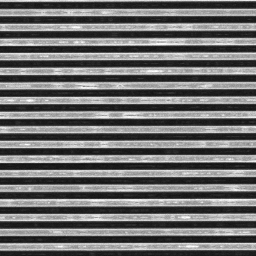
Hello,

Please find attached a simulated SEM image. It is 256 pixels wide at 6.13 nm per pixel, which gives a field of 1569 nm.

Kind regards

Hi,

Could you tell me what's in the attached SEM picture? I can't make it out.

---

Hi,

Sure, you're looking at parallel lines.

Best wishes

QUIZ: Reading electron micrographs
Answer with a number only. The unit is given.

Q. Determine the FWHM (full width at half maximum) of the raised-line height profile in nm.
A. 46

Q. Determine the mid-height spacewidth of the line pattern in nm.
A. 40.6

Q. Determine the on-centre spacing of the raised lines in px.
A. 14.6